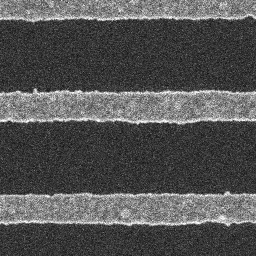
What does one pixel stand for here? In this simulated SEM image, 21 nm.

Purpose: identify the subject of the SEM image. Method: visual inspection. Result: one or a few lines or trenches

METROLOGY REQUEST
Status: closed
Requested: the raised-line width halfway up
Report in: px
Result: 28.1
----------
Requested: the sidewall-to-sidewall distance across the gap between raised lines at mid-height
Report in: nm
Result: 1540